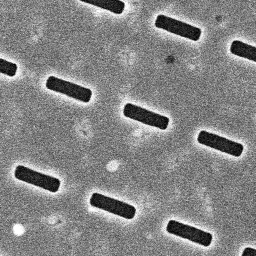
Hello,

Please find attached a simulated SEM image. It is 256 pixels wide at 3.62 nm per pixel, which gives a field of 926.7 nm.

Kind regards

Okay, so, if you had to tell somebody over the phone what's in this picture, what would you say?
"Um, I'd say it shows holes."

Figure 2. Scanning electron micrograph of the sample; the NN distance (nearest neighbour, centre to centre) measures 291 nanometres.